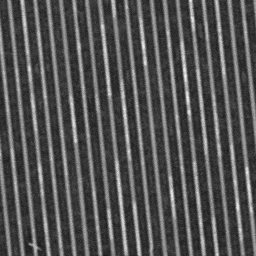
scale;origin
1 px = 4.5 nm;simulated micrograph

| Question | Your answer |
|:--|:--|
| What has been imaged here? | parallel lines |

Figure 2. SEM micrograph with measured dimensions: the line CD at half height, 15.6 nm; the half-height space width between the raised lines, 43.1 nm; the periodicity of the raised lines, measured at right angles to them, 12.9 px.